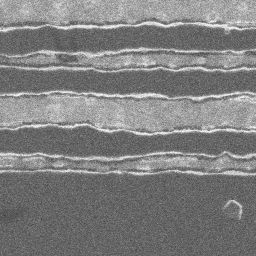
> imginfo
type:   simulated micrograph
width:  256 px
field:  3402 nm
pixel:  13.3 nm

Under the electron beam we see parallel lines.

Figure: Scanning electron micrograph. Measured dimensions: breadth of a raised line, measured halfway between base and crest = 0.355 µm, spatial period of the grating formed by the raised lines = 686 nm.